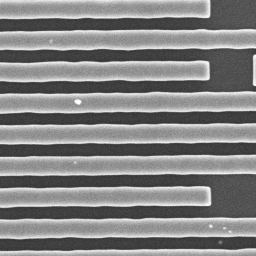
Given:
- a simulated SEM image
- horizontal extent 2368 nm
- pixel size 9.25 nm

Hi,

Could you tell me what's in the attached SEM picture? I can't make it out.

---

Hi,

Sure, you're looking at groups of lines, slits or small figures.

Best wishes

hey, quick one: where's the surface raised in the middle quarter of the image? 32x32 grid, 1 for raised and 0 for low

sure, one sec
11111111111111111111111111111111
11111111111111111111111111111111
11111111111111111111111111111111
11111111111111111111111111111111
00000000000000000000000000000000
00000000000000000000000000000000
00000000000000000000000000000000
00111111111111111111111111111111
11111111111111111111111111111111
11111111111111111111111111111111
11111111111111111111111111111111
11111111111111111111111111111111
00000000000000000000000000000000
00000000000000000000000000000000
00000000000000000000000000000000
11111111111111111111111111111111
11111111111111111111111111111111
11111111111111111111111111111111
11111111111111111111111111111111
11111111111111111111111111111111
00000000000000000000000000000000
00000000000000000000000000000000
00000000000000000000000000000000
11111111111111111111111111111111
11111111111111111111111111111111
11111111111111111111111111111111
11111111111111111111111111111111
11111111111111111111111110011111
00000000000000000000000000000000
00000000000000000000000000000000
00000000000000000000000000000000
11111111111111111111111111111111